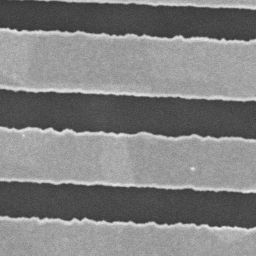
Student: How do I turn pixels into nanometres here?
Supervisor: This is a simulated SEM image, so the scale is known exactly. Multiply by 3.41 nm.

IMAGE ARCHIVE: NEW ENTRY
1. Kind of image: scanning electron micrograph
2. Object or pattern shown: lines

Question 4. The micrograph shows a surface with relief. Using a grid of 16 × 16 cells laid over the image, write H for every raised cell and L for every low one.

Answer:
LLLLLLLLLLLLLLLH
LLLLLLLLLLLLLLLL
HHHHHHHHHHHHHHLL
HHHHHHHHHHHHHHHH
HHHHHHHHHHHHHHHH
HHHHHHHHHHHHHHHH
LLLLLLLLLLLLLLLL
LLLLLLLLLLLLLLLL
HHHHHHHHHHLLLLLL
HHHHHHHHHHHHHHHH
HHHHHHHHHHHHHHHH
LLLLLHHHHHHHHHHH
LLLLLLLLLLLLLLLL
LLLLLLLLLLLLLLLL
HHHHHHHHHHHHHHHH
HHHHHHHHHHHHHHHH